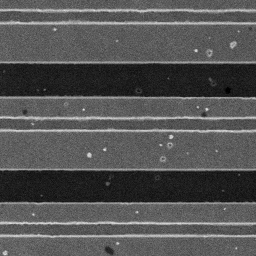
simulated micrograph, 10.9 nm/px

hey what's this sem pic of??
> lines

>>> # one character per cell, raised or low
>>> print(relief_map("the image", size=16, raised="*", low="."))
****************
****************
****************
****************
................
................
****************
****************
****************
****************
****************
................
................
****************
****************
****************